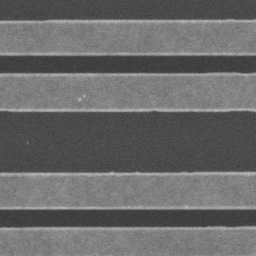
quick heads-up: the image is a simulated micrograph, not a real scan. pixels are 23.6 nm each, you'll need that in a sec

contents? lines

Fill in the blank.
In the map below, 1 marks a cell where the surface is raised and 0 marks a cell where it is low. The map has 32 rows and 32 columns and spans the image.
00000000000000000000000000000000
00000000000000000000000000000000
00000000000000000000000000000000
11111111111111111111111111111111
11111111111111111111111111111111
11111111111111111111111111111111
11111111111111111111111111111111
00000000000000000000000000000000
00000000000000000000000000000000
11111111111111111111111111111111
11111111111111111111111111111111
11111111111111111111111111111111
11111111111111111111111111111111
11111111111111111111111111111111
00000000000000000000000000000000
00000000000000000000000000000000
00000000000000000000000000000000
00000000000000000000000000000000
00000000000000000000000000000000
00000000000000000000000000000000
00000000000000000000000000000000
00000000000000000000000000000000
11111111111111111111111111111111
11111111111111111111111111111111
11111111111111111111111111111111
11111111111111111111111111111111
00000000000000000000000000000000
00000000000000000000000000000000
00011111111111111111111111111111
11111111111111111111111111111111
11111111111111111111111111111111
11111111111111111111111111111111